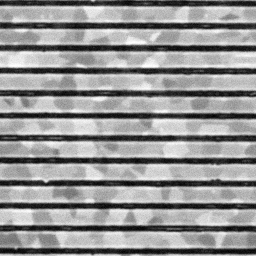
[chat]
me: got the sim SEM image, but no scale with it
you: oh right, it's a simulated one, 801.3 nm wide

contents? parallel lines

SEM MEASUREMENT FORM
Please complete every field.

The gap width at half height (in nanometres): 21.5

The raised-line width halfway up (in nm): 48.2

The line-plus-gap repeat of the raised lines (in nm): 70.6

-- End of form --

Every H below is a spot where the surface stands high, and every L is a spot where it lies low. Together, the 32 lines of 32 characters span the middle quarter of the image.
HHHHHHHHHHHHHHHHHHHHHHHHHHHHHHHH
LLLLLLLLLLLLLLLLLLLLLLLLLLLLLLLL
LLLLLLLLLLLLLLLLLLLLLLLLLLLLLLLL
HHHHHHHHHHHHHHHHHHHHHHHHHHHHHHHH
HHHHHHHHHHHHHHHHHHHHHHHHHHHHHHHH
HHHHHHHHHHHHHHHHHHHHHHHHHHHHHHHH
LLLLLLLLLLLLLLLLLLLLLLLLLLLLLLLL
LLLLLLLLLLLLLLLLLLLLLLLLLLLLLLLL
HHHHHHHHHHHHHHHHHHHHLLHHHHHHHHHH
HHHHHHHHHHHHHHHHHHHHHHHHHHHHHHHH
HHHHHHHHHHHHHHHHHHHHHHHHHHHHHHHH
HHHHHHHHHHHHHHHHHHHHHHHHHHHHHHHH
LLLLLLLLLLLLLLLLLLLLLLLLLLLLLLLL
LLLLLLLLLLLLLLLLLLLLLLLLLLLLLLLL
HHHHHHHHHHHHHHHHHHHHHHHHHHHHHHHH
HHHHHHHHHHHHHHHHHHHHHHHHHHHHHHHH
HHHHHHHHHHHHHHHHHHHHHHHHHHHHHHHH
LLLLLLLHHHHHLLLLLLHHHHHHHHHHHHHH
LLLLLLLLLLLLLLLLLLLLLLLLLLLLLLLL
LLLLLLHLHHLLLHLLLLLLLLLLHLLLLHHL
HHHHHHHHHHHHHHHHHHHHHHHHHHHHHHHH
HHHHHHHHHHHHHHHHHHHHHHHHHHHHHHHH
HHHHHHHHHHHHHHHHHHHHHHHHHHHHHHHH
LLLLLLLLLLLLLLLLLLLLLLLLLLLLLLLL
LLLLLLLLLLLLLLLLLLLLLLLLLLLLLLLL
HHHHHHHHHHHHHHHHHHHHHHHHHHHHHHHH
HHHHHHHHHHHHHHHHHHHHHHHHHHHHHHHH
HHHHHHHHHHHHHHHHHHHHHHHHHHHHHHHH
HHHHHHHHHHHHHHHHHHHHHHHHHHHHHHHH
LLLLLLLLLLLLLLLLLLLLLLLLLLLLLLLL
LLLLLLLLLLLLLLLLLLLLLLLLLLLLLLLL
HHHHHHHHHHHHHHHHHHHHHHHHHHHHHHHH